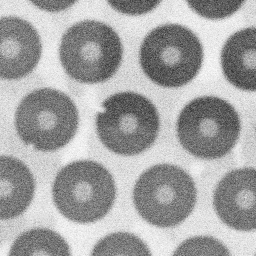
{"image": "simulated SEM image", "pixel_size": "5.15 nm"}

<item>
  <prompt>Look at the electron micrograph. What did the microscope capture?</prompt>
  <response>an array of small figures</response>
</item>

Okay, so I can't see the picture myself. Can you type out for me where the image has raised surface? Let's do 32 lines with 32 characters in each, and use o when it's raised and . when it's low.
oooo.....ooooo......ooo.......oo
oooooo.oooooooo....ooooo..o...oo
...oooooooo.oooooooooooooooooooo
....ooooo.....ooooo.....oooooooo
.....ooo.......ooo.......oooo..o
oo...oo....o...ooo.......ooo....
oo...oo...oo...oo...oo...ooo...o
.....oo....o...oo...oo...oo...oo
....oooo.......ooo.......ooo...o
...oooooo....ooooo.......ooo....
ooooooooooo.oooooooo..ooooooo...
oooo....ooooooo..oooooooooooooo.
ooo......oooo......ooooo....oooo
oo........ooo......oooo......ooo
oo...oo...oo........oo........oo
oo...oo...oo...oo...oo...oo...oo
oo........oo........oo...oo...oo
ooo......ooo.......ooo........oo
oooo....ooooo......oooo......ooo
.oooooooooooooo.oooooooo....oooo
...ooooo.....ooooooo..oooooooooo
....ooo.......oooo.....oooooo...
....ooo.......ooo.......ooo.....
o...oo...oo...ooo...o...ooo.....
o...oo...oo....oo...oo...oo...oo
....ooo.......ooo.......ooo...oo
...oooo.......ooo.......ooo.....
ooooooooo...oooooo.....ooooo....
oooo..ooooooooooooooooooooooo...
oo......ooooo....ooooooo..oooooo
o........ooo......oooo......oooo
o....o...oo........ooo.......ooo